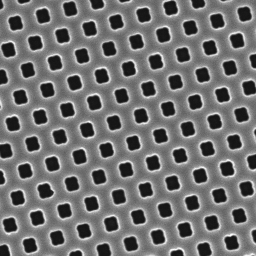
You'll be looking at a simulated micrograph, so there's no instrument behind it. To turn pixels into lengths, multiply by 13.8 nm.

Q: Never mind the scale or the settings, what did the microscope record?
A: a regular array of holes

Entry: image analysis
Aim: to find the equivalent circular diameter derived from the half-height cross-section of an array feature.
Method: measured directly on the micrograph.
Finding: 197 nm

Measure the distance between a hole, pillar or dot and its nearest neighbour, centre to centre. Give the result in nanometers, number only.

384